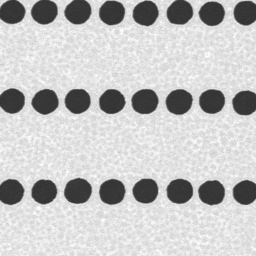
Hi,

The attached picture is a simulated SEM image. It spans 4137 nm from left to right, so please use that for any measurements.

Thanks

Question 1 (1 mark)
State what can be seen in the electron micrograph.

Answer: a regular array of holes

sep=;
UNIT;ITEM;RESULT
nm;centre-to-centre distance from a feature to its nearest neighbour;536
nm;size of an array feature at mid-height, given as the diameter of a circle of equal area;421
